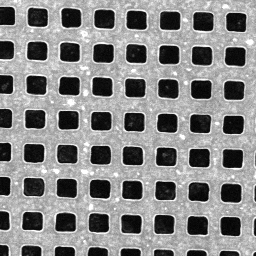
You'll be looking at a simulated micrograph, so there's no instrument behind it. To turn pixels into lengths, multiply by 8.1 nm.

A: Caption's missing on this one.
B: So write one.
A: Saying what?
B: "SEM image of a regular array of holes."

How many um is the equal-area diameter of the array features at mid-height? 0.177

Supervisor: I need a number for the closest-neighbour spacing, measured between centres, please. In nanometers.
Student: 267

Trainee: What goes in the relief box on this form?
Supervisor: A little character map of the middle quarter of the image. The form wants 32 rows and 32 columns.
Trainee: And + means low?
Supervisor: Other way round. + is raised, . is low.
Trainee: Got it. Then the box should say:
++++++++++++++++++++++++++++++++
++++++++++++++++++++++++++++++++
++++++++++++++++++++++++++++++++
....++++...+++++++++++++++++++++
....+++.....+++.....+++......+++
....+++.....+++......++......+++
....+++.....+++......++......+++
....+++.....+++.....++++.....+++
+++++++++++++++++..++++++...++++
++++++++++++++++++++++++++++++++
++++++++++++++++++++++++++++++++
++++++++++++++++++++++++++++++++
....+++.....+++.....++++...+++++
....+++.....+++.....+++.....+++.
....+++.....+++.....+++......++.
....+++.....+++.....+++......++.
...++++....++++.....+++.....++++
++++++++++++++++++++++++++++++++
++++++++++++++++++++++++++++++++
++++++++++++++++++++++++++++++++
...++++....++++.++++++++++++++++
...++++.....+++.....+++.....+++.
...++++.....+++.....+++.....+++.
...+++......+++.....+++.....+++.
...++++.....+++.....+++.....+++.
++++++++++++++++++++++++....++++
++++++++++++++++++++++++++++++++
++++++++++++++++++++++++++++++++
++++++++++++++++++++++++++++++++
...++++....++++....++++....+++++
...+++......+++.....+++.....+++.
...+++......++......+++.....+++.